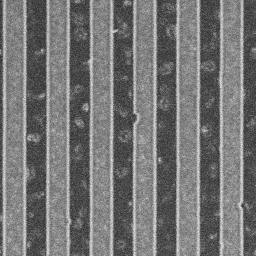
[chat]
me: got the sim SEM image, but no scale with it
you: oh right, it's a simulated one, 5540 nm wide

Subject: parallel lines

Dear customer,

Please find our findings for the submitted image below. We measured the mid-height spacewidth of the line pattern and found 490 nm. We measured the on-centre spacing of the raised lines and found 938 nm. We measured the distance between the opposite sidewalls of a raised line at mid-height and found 449 nm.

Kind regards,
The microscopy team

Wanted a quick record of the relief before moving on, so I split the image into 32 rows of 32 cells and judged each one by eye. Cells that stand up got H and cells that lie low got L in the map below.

LHHLLLHHHLLHHHLLLHHLLLHHHLLLHHLL
LHHLLLHHHLLHHHLLLHHLLLHHHLLLHHLL
LHHLLLHHHLLHHHLLLHHLLLHHHLLLHHLL
LHHLLLHHHLLHHHLLLHHLLLHHHLLLHHLL
LHHLLLHHHLLHHHLLLHHLLLHHHLLLHHLL
LHHLLLHHHLLHHHLLLHHLLLHHHLLLHHLL
LHHLLLHHHLLHHHLLLHHLLLHHHLLLHHLL
LHHLLLHHLLLHHHLLLHHLLLHHHLLLHHLL
LHHLLLHHLLLHHHLLLHHLLLHHHLLLHHLL
LHHLLLHHLLLHHHLLLHHLLLHHHLLLHHLL
LHHLLLHHLLLHHHLLLHHLLLHHHLLLHHLL
LHHLLLHHLLLHHHLLLHHLLLHHHLLLHHLL
LHHLLLHHHLLHHHLLLHHLLLHHHLLLHHLL
LHHLLLHHLLLHHHLLLHHLLLHHHLLLHHLL
LHHLLLHHLLLHHHLLLHHLLLHHHLLLHHLL
LHHLLLHHLLLHHHLLLHHLLLHHHLLLHHLL
LHHLLLHHLLLHHHLLLHHLLLHHHLLLHHLL
LHHLLLHHLLLHHHLLLHHLLLHHHLLLHHLL
LHHLLLHHLLLHHHLLLHHLLLHHHLLLHHLL
LHHLLLHHLLLHHHLLLHHLLLHHHLLLHHLL
LHHLLLHHHLLHHHLLLHHLLLHHHLLLHHLL
LHHLLLHHHLLHHHLLLHHLLLHHHLLLHHLL
LHHLLLHHHLLHHHLLLHHLLLHHHLLLHHLL
LHHLLLHHHLLHHHLLLHHLLLHHHLLLHHLL
LHHLLLHHHLLHHHLLLHHLLLHHHLLLHHLL
LHHLLLHHHLLHHHLLLHHLLLHHHLLLHHLL
LHHLLLHHHLLHHHLLLHHLLLHHHLLLHHLL
LHHLLLHHHLLHHHLLLHHLLLHHHLLLHHLL
LHHLLLHHHLLHHHLLLHHLLLHHHLLLHHLL
LHHLLLHHHLLHHHLLLHHLLLHHHLLLHHLL
LHHLLLHHHLLHHHLLLHHLLLHHHLLLHHLL
LHHLLLHHHLLHHHLLLHHLLLHHHLLLHHLL